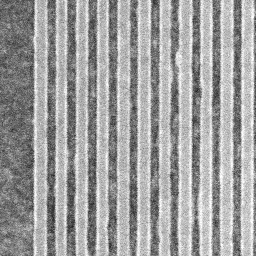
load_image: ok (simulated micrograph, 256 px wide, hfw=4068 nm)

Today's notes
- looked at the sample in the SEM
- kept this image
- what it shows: parallel lines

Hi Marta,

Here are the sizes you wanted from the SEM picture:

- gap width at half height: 0.161 micrometres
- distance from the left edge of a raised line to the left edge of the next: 20.7 px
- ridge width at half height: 11 pixels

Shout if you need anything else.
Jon